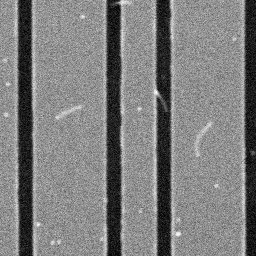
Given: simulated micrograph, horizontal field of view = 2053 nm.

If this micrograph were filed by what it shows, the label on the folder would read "lines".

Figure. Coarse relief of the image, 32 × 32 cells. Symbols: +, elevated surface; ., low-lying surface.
++..+++++++++..++++..+++++++++..
++..+++++++++..++++..+++++++++..
++..+++++++++..++++..+++++++++..
++..+++++++++..++++..+++++++++..
++..+++++++++..++++..+++++++++..
++..+++++++++..++++...++++++++..
++..+++++++++..++++...++++++++..
++..+++++++++..++++...++++++++..
++..+++++++++..++++..+++++++++..
++..+++++++++..++++...++++++++..
++..+++++++++..++++...++++++++..
++..+++++++++..+++++..++++++++..
++..+++++++++..++++...++++++++..
++..+++++++++..++++...++++++++..
++..+++++++++..++++...++++++++..
++..+++++++++..++++...++++++++..
++..+++++++++..++++...++++++++..
++..+++++++++..++++...++++++++..
++..+++++++++..++++...+++++++++.
++..+++++++++..++++...+++++++++.
++..+++++++++..++++...+++++++++.
++..+++++++++..++++...+++++++++.
++..+++++++++..++++...+++++++++.
++..+++++++++..++++...+++++++++.
++..+++++++++..++++...+++++++++.
++..+++++++++..++++...+++++++++.
++..+++++++++..++++...+++++++++.
++..+++++++++..++++...+++++++++.
++..+++++++++..++++...+++++++++.
++..+++++++++..++++...+++++++++.
++..+++++++++..++++...+++++++++.
++..+++++++++..++++...+++++++++.